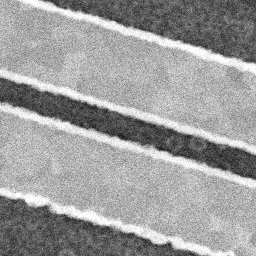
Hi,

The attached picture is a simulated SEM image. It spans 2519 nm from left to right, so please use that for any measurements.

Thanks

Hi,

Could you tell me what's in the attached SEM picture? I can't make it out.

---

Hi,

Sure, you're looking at one or a few lines or trenches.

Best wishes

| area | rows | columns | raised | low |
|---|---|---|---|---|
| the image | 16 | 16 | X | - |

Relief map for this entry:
XXX-------------
XXXXXXX---------
XXXXXXXXXX------
XXXXXXXXXXXXX---
XXXXXXXXXXXXXXXX
---XXXXXXXXXXXXX
------XXXXXXXXXX
XXX-------XXXXXX
XXXXXX-------XXX
XXXXXXXXX-------
XXXXXXXXXXXXX---
XXXXXXXXXXXXXXXX
--XXXXXXXXXXXXXX
-----XXXXXXXXXXX
---------XXXXXXX
------------XXXX